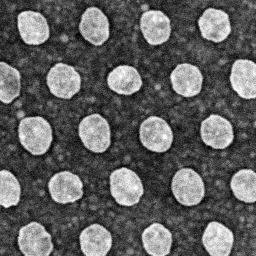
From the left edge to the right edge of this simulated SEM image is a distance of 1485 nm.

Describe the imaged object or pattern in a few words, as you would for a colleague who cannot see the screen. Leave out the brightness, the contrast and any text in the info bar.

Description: a regular array of raised bodies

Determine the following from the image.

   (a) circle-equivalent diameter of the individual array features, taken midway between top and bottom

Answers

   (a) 184 nm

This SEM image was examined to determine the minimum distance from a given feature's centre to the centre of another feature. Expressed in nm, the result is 349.